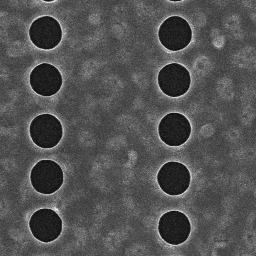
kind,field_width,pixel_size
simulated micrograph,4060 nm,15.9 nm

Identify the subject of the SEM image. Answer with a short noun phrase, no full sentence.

a regular array of holes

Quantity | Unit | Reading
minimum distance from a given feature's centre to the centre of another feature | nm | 750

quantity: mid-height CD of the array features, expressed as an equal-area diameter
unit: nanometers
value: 533